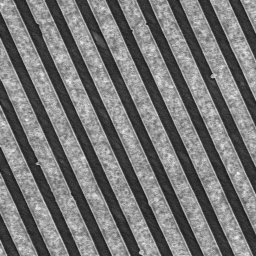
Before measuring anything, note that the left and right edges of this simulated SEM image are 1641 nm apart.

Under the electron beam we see parallel lines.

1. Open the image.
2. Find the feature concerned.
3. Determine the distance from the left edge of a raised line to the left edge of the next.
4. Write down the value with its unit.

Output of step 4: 179 nm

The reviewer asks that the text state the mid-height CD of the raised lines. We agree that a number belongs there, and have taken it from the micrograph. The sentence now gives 0.104 um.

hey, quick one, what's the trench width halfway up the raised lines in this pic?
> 0.0728 microns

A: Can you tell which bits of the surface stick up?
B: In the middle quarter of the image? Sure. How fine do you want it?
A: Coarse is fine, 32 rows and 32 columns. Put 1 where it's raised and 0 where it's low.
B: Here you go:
11000011110001111100011110000111
11100011111000111100001111000111
11100001111000111110001111000011
11110001111000011110001111100011
11110000111100011111000111100001
11111000111100001111000111110001
01111000111110001111000011110000
01111100011110000111100011111000
00111100011111000111110001111000
00111110001111000011110001111100
00011110001111100011110000111100
00011111000111100001111000111100
00001111000111110001111000011110
10001111000011110001111100011110
10000111100011110000111100011111
11000111100001111000111110001111
11000111110001111000011110001111
11000011110000111100011111000111
11100011111000111100001111000111
11100001111000111110001111100011
11110001111000011110000111100011
11110000111100011111000111100001
11111000111100001111000011110001
01111000011110001111100011110000
01111100011110000111100011111000
00111100001111000111100001111000
00111110001111000011110001111100
00011110001111100011110000111100
00011110000111100011111000111100
00001111000111110001111000011110
10001111000011110001111100011111
10001111100011111000111100001111